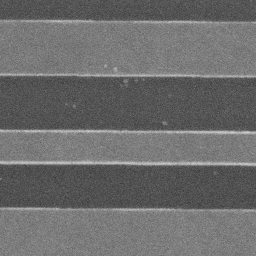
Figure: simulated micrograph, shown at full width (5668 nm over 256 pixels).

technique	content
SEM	lines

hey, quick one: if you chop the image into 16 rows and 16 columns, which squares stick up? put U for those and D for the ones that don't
DDDDDDDDDDDDDDDD
UUUUUUUUUUUUUUUU
UUUUUUUUUUUUUUUU
UUUUUUUUUUUUUUUU
UUUUUUUUUUUUUUUU
DDDDDDDDDDDDDDDD
DDDDDDDDDDDDDDDD
DDDDDDDDDDDDDDDD
UUUUUUUUUUUUUUUU
UUUUUUUUUUUUUUUU
DDDDDDDDDDDDDDDD
DDDDDDDDDDDDDDDD
DDDDDDDDDDDDDDDD
UUUUUUUUUUUUUUUU
UUUUUUUUUUUUUUUU
UUUUUUUUUUUUUUUU